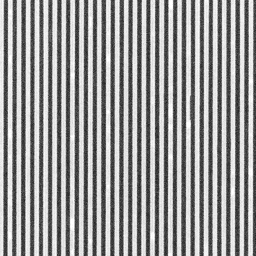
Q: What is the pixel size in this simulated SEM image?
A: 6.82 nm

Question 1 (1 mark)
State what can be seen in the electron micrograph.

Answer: parallel lines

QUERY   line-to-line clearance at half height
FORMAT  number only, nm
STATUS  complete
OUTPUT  35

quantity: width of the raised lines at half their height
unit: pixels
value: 4.25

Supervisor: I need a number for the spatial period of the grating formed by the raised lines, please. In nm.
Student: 60.9